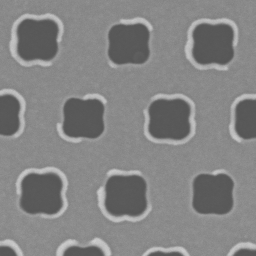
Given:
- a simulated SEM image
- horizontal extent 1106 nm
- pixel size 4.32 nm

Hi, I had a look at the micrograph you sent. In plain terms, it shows a regular array of holes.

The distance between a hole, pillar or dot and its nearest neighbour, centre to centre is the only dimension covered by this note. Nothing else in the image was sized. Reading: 367 nm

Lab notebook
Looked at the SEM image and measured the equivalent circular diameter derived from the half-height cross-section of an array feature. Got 188 nanometres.